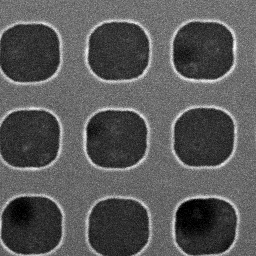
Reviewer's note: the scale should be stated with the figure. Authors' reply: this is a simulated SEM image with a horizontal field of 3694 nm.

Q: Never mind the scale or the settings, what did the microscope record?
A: holes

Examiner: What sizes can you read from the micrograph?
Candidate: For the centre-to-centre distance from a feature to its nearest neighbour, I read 1.24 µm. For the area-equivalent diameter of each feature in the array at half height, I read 915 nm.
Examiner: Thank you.